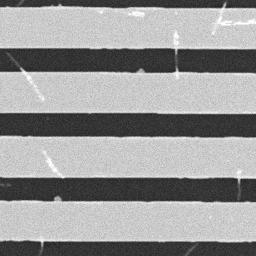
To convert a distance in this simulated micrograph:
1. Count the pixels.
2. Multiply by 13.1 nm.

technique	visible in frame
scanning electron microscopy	lines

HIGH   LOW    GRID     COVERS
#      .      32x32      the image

................................
################################
################################
################################
################################
################################
................................
................................
................................
################################
################################
################################
################################
################################
................................
................................
................................
################################
################################
################################
################################
################################
................................
................................
................................
################################
################################
################################
################################
################################
................................
................................